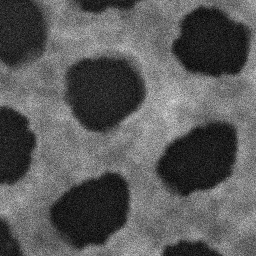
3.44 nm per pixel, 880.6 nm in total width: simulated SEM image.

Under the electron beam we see holes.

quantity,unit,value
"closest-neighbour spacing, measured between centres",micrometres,0.4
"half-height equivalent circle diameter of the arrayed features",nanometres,254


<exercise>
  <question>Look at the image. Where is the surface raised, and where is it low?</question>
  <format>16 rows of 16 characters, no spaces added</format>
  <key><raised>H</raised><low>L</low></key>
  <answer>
LLLHHLLHHHHHLHHH
LLLHHHHHHHHLLLLH
LLLHHHHHHHHLLLLL
LLHHHHHHHHHLLLLL
HHHHLLLLLHHHLLLH
HHHHLLLLLHHHHHHH
HHHHLLLLLHHHHHHH
LLHHHLLLHHHHHHHH
LLHHHHHHHHHLLLLH
LLHHHHHHHHLLLLLH
LLHHHHHHHHLLLLHH
HHHHHLLLHHLLLLHH
HHHHLLLLHHHHHHHH
HHHLLLLLHHHHHHHH
LHHHLLLHHHHHHHHH
LHHHHHHHHHLLLHHH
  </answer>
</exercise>